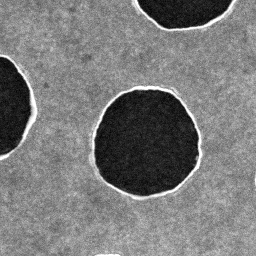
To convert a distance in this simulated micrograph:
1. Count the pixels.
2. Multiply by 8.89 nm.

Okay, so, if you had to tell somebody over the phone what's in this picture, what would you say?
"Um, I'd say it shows holes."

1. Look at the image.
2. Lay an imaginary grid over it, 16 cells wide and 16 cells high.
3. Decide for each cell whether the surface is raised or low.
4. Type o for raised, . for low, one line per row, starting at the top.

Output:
ooooooooo.....oo
oooooooooo...ooo
oooooooooooooooo
oooooooooooooooo
.ooooooooooooooo
..oooooooooooooo
..ooooo....ooooo
..oooo......oooo
.ooooo......oooo
.ooooo......oooo
oooooo......oooo
ooooooo....ooooo
oooooooooooooooo
oooooooooooooooo
oooooooooooooooo
oooooooooooooooo